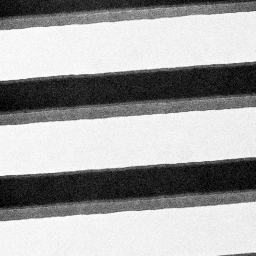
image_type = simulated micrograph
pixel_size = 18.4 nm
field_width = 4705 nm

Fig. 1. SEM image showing lines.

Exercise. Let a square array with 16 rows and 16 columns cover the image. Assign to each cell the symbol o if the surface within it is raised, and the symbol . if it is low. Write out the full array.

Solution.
...........ooooo
oooooooooooooooo
oooooooooooooooo
oooooooooooooooo
ooooooo.........
................
.........ooooooo
oooooooooooooooo
oooooooooooooooo
oooooooooooooooo
ooooooo.........
................
.........ooooooo
oooooooooooooooo
oooooooooooooooo
oooooooooooooooo